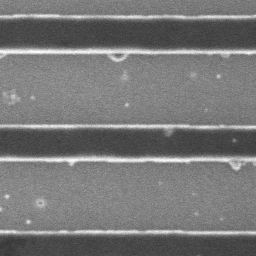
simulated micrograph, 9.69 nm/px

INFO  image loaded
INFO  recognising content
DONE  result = lines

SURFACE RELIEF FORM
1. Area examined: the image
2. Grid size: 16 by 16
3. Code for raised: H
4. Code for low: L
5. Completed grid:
LLLLLLLLLLLLLLLL
HHHHHHHHHHHHHHHH
HHHHHHHHHHHHHHHH
LLLLLLLLLLLLLLLL
LLLLLLLLLLLLLLLL
LLLLLLLLLLLLLLLL
LLLLLLLLLLLLLLLL
LLLLLLLLLLLLLLLL
HHHHHHHHHHHHHHHH
HHHHHHHHHHHHHHHH
LLLLLLLLLLLLLLLL
LLLLLLLLLLLLLLLL
LLLLLLLLLLLLLLLL
LLLLLLLLLLLLLLLL
HLLHHHHHHHHHLLLL
HHHHHHHHHHHHHHHH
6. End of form